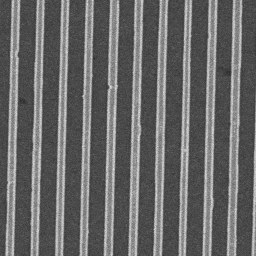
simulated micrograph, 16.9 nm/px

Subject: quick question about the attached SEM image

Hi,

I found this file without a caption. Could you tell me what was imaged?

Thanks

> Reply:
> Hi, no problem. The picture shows parallel lines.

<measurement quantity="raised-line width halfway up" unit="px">5.88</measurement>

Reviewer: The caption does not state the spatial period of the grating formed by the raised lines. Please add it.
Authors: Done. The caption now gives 0.416 micrometres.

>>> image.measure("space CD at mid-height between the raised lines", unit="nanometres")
312